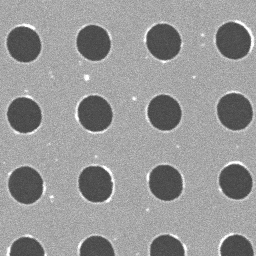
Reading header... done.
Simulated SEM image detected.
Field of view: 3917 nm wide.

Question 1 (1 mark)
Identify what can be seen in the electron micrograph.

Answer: a regular array of holes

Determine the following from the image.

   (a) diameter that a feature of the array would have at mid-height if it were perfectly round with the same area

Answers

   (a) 555 nm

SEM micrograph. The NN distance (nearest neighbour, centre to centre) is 1.07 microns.